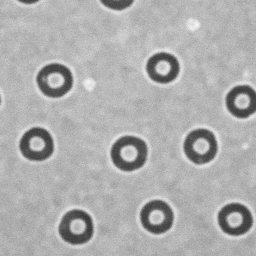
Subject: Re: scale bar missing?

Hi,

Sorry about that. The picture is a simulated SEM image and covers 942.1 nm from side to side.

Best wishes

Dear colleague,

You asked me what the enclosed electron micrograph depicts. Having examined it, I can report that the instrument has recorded a regular array of ring-shaped grooves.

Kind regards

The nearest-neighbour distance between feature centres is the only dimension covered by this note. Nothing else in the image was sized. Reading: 258 nm